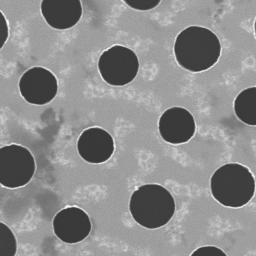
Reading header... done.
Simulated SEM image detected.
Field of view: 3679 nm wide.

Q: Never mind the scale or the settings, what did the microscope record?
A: a regular array of holes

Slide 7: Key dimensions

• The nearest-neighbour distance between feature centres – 1180 nm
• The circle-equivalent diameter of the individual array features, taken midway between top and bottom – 554 nm